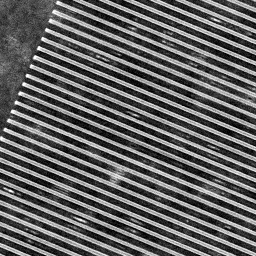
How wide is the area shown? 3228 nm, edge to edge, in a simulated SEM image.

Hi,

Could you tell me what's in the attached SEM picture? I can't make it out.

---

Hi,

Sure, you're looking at parallel lines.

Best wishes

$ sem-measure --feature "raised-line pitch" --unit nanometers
124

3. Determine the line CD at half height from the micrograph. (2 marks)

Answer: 36.4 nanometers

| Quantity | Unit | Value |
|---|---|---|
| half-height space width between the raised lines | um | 0.0859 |